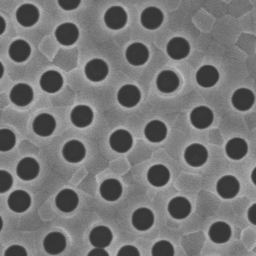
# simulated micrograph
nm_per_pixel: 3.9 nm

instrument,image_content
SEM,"a regular array of holes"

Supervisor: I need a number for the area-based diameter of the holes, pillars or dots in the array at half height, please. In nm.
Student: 85.6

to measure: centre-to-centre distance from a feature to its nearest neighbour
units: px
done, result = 38.1